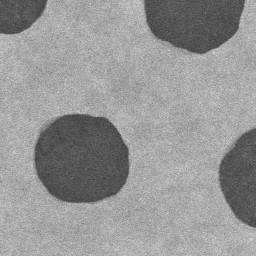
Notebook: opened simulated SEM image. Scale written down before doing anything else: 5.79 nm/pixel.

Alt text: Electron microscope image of holes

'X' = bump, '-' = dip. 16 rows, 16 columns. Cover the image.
---XXXXXX------X
--XXXXXXX------X
XXXXXXXXXX----XX
XXXXXXXXXXXXXXXX
XXXXXXXXXXXXXXXX
XXXXXXXXXXXXXXXX
XXXXXXXXXXXXXXXX
XXX----XXXXXXXXX
XX------XXXXXXX-
XX------XXXXXX--
XX------XXXXXX--
XXX-----XXXXXX--
XXXX--XXXXXXXX--
XXXXXXXXXXXXXXX-
XXXXXXXXXXXXXXXX
XXXXXXXXXXXXXXXX